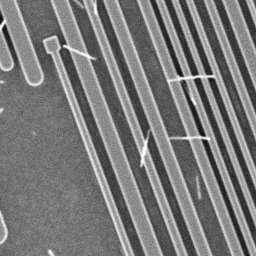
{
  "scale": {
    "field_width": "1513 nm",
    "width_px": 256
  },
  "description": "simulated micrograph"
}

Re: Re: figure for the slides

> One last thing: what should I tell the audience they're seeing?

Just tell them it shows groups of lines, slits or small figures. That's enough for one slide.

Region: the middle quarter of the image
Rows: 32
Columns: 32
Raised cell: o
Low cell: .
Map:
...oooo....oo...ooo......oo..oo.
...oooo....ooo..oooo.....ooo..o.
o..ooooo....oo...ooo.....ooo..oo
o...oooo....oo...oooo.....oooooo
o...ooooo...ooo..oooo.....ooo.oo
oo...oooo....oo...ooo.....ooo..o
oo...oooo....ooo..oooo.....ooo.o
.oo..ooooo...ooo...ooo.....ooo.o
.oo...oooo....oo...ooo.....ooo..
.oo...oooo....ooo..oooo.....ooo.
..oo...oooo....oo...ooo.....ooo.
..oo...oooo....oo...ooo......oo.
...o...ooooo...ooo...ooo.....ooo
...oo...oooo....oo...ooo.....ooo
...oo...oooo....oo...oooo.....oo
...oo...ooooo....oo..oooo.....oo
....oo...oooo....oo...ooo.....oo
....oo...oooo....ooo..oooo.....o
.....oo...oooo....oo...ooo.....o
.....oo...oooo....ooo..ooo.....o
.....oo...oooo....ooo..oooo.....
......oo...oooo....oo...ooo.....
......oo...oooo....oo...oooo....
.......o...ooooo...ooo...ooo....
.......oo...oooo...ooo...ooo....
.......oo...oooo....oo...oooo...
........oo..ooooo....oo...ooo...
........oo...oooo....oo...oooo..
........oo...oooo....ooo..oooo..
.........oo...oooo....oo...ooo..
.........oo...oooo....oo...ooo..
..........oo..ooooo...ooo..oooo.